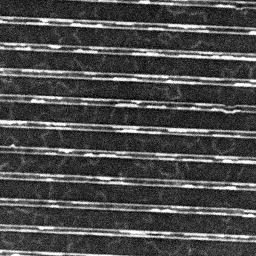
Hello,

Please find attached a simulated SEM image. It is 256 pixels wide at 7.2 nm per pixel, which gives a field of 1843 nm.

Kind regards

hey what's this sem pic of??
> parallel lines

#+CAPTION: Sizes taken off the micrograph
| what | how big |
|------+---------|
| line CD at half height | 0.0476 um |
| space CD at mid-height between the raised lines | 144 nm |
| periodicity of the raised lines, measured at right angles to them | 187 nm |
